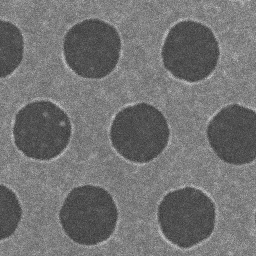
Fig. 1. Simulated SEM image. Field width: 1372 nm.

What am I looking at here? holes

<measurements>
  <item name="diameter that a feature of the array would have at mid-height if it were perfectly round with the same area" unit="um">0.326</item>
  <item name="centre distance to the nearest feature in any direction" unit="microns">0.516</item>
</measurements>